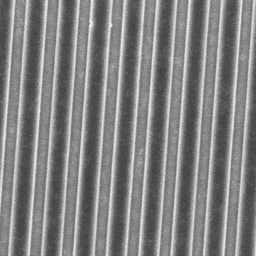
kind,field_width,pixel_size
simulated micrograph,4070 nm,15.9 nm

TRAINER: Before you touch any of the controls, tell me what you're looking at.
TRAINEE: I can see parallel lines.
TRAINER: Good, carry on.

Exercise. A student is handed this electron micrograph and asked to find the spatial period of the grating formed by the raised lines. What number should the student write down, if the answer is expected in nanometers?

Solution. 514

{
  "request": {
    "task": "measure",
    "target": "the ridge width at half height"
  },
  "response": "321 nanometres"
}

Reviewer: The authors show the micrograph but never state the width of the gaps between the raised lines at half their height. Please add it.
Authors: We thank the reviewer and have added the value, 194 nanometres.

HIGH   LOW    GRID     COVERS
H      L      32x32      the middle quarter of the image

HHHLLLHHHHHLLLHHHHHLLLHHHHHLLLHH
HHHLLLHHHHHLLLHHHHHLLLHHHHHLLLHH
HHLLLLHHHHHLLLHHHHHLLLHHHHHLLLHH
HHLLLHHHHHHLLLHHHHHLLLHHHHHLLLHH
HHLLLHHHHHLLLLHHHHHLLLHHHHHLLLHH
HHLLLHHHHHLLLLHHHHHLLLHHHHHLLLHH
HHLLLHHHHHLLLLHHHHLLLLHHHHHLLLHH
HHLLLHHHHHLLLLHHHHLLLLHHHHHLLLHH
HHLLLHHHHHLLLHHHHHLLLLHHHHLLLLHH
HHLLLHHHHHLLLHHHHHLLLLHHHHLLLLHH
HHLLLHHHHHLLLHHHHHLLLHHHHHLLLLHH
HHLLLHHHHHLLLHHHHHLLLHHHHHLLLHHH
HHLLLHHHHHLLLHHHHHLLLHHHHHLLLHHH
HHLLLHHHHHLLLHHHHHLLLHHHHHLLLHHH
HHLLLHHHHHLLLHHHHHLLLHHHHHLLLHHH
HHLLLHHHHHLLLHHHHHLLLHHHHHLLLHHH
HLLLLHHHHHLLLHHHHHLLLHHHHHLLLHHH
HLLLLHHHHHLLLHHHHHLLLHHHHHLLLHHH
HLLLLHHHHLLLLHHHHHLLLHHHHHLLLHHH
HLLLLHHHHLLLLHHHHHLLLHHHHHLLLHHH
HLLLHHHHHLLLLHHHHLLLLHHHHHLLLHHH
HLLLHHHHHLLLLHHHHLLLLHHHHHLLLHHH
HLLLHHHHHLLLHHHHHLLLLHHHHLLLLHHH
HLLLHHHHHLLLHHHHHLLLLHHHHLLLHHHH
HLLLHHHHHLLLHHHHHLLLHHHHHLLLHHHH
HLLLHHHHHLLLHHHHHLLLHHHHHLLLHHHH
HLLLHHHHHLLLHHHHHLLLHHHHHLLLHHHH
HLLLHHHHHLLLHHHHHLLLHHHHHLLLHHHH
HLLLHHHHHLLLHHHHHLLLHHHHHLLLHHHH
HLLLHHHHHLLLHHHHHLLLHHHHHLLLHHHH
LLLLHHHHHLLLHHHHHLLLHHHHHLLLHHHH
LLLLHHHHHLLLHHHHHLLLHHHHHLLLHHHH